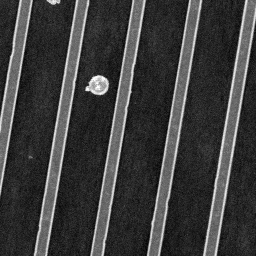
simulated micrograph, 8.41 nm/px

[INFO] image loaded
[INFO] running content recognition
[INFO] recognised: parallel lines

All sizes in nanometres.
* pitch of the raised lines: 467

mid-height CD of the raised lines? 89.1 nm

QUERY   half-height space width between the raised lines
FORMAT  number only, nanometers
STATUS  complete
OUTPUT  372